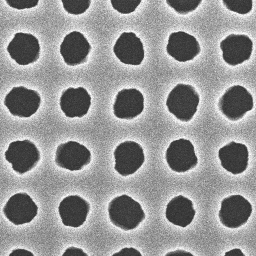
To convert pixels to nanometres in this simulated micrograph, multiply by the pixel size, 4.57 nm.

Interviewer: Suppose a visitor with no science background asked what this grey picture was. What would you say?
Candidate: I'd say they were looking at a regular array of holes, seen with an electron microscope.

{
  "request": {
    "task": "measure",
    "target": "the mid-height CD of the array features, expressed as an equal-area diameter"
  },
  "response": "142 nm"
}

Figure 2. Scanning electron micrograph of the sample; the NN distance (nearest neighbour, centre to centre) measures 242 nanometers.